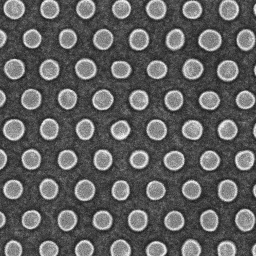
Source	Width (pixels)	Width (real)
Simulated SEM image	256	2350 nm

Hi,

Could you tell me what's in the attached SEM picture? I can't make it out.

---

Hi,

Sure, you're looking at a regular array of raised bodies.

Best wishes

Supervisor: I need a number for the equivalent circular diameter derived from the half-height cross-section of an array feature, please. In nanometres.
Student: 178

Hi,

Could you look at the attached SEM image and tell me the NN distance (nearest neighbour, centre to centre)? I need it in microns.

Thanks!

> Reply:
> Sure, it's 0.316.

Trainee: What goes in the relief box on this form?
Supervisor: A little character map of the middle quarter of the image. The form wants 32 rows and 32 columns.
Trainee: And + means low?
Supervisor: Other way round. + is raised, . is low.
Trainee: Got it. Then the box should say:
...+++++....++++.....+++++....++
...+++++....++++.....+++++....++
...+++++....++++.....+++++....++
....++.........................+
................................
................................
++..............................
+++.....++++.....++++.....+++...
+++....+++++.....++++....+++++..
+++....+++++.....++++....+++++..
++......++++.....++++.....+++...
................................
................................
................................
....+++.......+.......+++......+
...+++++....++++.....++++.....++
...+++++....++++.....++++.....++
...++++.....++++.....++++.....++
....++.......++.......+++......+
................................
................................
................................
+++.....+++......+++......+++...
+++.....++++.....++++....+++++..
+++.....++++.....++++....+++++..
++......+++......+++......++++..
................................
................................
................................
....++.......++.......++.......+
...++++.....++++.....++++.....++
...+++++....++++.....++++.....++